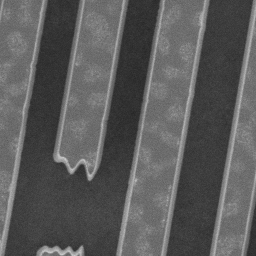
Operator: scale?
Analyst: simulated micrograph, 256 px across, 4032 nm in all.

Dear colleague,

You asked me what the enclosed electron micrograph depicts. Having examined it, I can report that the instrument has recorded one or a few lines or trenches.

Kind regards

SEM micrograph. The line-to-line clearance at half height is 594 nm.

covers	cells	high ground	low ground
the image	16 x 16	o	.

ooo..ooo..ooo...
ooo..ooo..ooo...
oo...oo...oo....
oo...oo...oo...o
oo..ooo..ooo...o
oo..ooo..ooo...o
oo..ooo..ooo...o
oo..ooo..ooo...o
o...oo...oo....o
o...oo...oo...oo
o....o..ooo...oo
o.......ooo...oo
o.......ooo...oo
o.......ooo...oo
........oo....o.
.......ooo...oo.